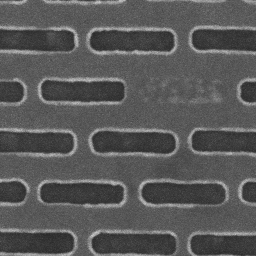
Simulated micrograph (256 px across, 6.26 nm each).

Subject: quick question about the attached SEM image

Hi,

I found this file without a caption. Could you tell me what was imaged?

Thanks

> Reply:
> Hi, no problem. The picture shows holes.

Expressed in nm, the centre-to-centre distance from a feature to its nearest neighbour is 440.